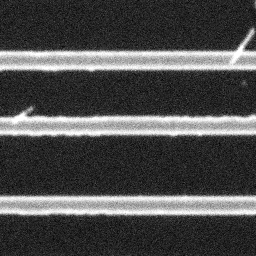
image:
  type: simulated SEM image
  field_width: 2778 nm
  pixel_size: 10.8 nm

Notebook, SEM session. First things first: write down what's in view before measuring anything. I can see lines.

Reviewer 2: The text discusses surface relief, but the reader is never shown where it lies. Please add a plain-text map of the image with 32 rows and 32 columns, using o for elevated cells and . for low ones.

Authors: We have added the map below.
................................
................................
................................
................................
................................
................................
.............................oo.
oooooooooooooooooooooooooooooooo
oooooooooooooooooooooooooooooooo
................................
................................
................................
................................
................................
..o.............................
oooooooooooooooooooooooooooooooo
oooooooooooooooooooooooooooooooo
................................
................................
................................
................................
................................
................................
................................
................................
oooooooooooooooooooooooooooooooo
oooooooooooooooooooooooooooooooo
................................
................................
................................
................................
................................